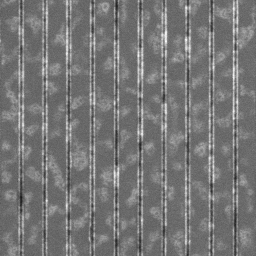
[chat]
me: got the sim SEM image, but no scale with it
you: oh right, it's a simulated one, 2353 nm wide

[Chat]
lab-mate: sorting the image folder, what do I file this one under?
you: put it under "parallel lines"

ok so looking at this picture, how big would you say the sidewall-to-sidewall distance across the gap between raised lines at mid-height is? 0.179 µm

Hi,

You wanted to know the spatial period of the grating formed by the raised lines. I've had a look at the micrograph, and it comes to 219 nm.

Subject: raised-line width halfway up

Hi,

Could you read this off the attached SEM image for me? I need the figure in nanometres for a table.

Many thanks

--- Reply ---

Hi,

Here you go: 39.1